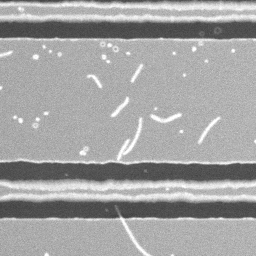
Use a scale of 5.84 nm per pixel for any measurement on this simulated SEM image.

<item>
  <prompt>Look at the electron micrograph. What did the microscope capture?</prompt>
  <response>lines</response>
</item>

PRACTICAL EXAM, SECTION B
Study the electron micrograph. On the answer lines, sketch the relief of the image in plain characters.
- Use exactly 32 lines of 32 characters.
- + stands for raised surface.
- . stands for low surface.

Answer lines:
++++++++++++++++++++++++++++++++
++++++++++++++++++++++++++++++++
++++++.+++++++++++++++++++++++++
................................
................................
++++++++++++++++++++++++++++++++
++++++++++++++++++++++++++++++++
++++++++++++++++++++++++++++++++
++++++++++++++++++++++++++++++++
++++++++++++++++++++++++++++++++
++++++++++++++++++++++++++++++++
++++++++++++++++++++++++++++++++
++++++++++++++++++++++++++++++++
++++++++++++++++++++++++++++++++
++++++++++++++++++++++++++++++++
++++++++++++++++++++++++++++++++
++++++++++++++++++++++++++++++++
++++++++++++++++++++++++++++++++
++++++++++++++++++++++++++++++++
++++++++++++++++++++++++++++++++
...........................++...
................................
................................
++++++++++++++++++++++++++++++++
++++++++++++++++++++++++++++++++
................................
................................
++++++++++++++++++++++++++++++++
++++++++++++++++++++++++++++++++
++++++++++++++++++++++++++++++++
++++++++++++++++++++++++++++++++
++++++++++++++++++++++++++++++++